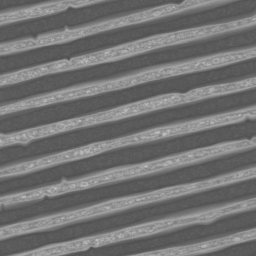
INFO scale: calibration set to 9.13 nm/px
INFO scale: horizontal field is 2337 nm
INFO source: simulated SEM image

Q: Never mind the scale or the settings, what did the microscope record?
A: parallel lines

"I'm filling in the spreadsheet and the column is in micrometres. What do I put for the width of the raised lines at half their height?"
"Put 0.12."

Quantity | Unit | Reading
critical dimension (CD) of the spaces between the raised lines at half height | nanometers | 143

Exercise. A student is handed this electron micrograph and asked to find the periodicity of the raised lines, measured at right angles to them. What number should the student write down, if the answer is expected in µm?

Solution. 0.271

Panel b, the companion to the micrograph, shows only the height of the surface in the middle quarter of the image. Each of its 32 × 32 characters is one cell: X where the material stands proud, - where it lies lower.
XXXXXXX---------------XXXXXXXXXX
XXX---------------XXXXXXXXXXXXXX
---------------XXXXXXXXXXXXXXX--
------------XXXXXXXXXXXXX-------
------XXXXXXXXXXXXXXX-----------
-XXXXXXXXXXXXXXXXX--------------
XXXXXXXXXXXXXX------------------
XXXXXXXXX----------------XXXXXXX
XXXXX----------------XXXXXXXXXXX
-----------------XXXXXXXXXXXXXXX
--------------XXXXXXXXXXXXXXX---
----------XXXXXXXXXXXXXX--------
-------XXXXXXXXXXXXX------------
---XXXXXXXXXXXX-----------------
XXXXXXXXXXXX---------------XXXXX
XXXXXXXX----------------XXXXXXXX
XXX-----------------XXXXXXXXXXXX
-----------------XXXXXXXXXXXXXX-
-------------XXXXXXXXXXXXXX-----
--------XXXXXXXXXXXXXX----------
-----XXXXXXXXXXX----------------
-XXXXXXXXXXX-------------------X
XXXXXXXXX-------------------XXXX
XXXXX-------------------XXXXXXXX
X-------------------XXXXXXXXXXXX
-------------XXXXXXXXXXXXXXXXXXX
----------XXXXXXXXXXXXXXXXX-----
------XXXXXXXXXXXXXXXXX---------
---XXXXXXXXXXXXXXX--------------
XXXXXXXXXXXXXX------------------
XXXXXXXXXX------------------XXXX
XXXXX-------------------XXXXXXXX